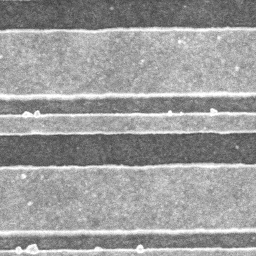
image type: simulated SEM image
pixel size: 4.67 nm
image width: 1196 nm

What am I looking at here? lines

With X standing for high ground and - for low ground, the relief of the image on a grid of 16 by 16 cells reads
----------------
----------------
XXXXXXXXXXXXXXXX
XXXXXXXXXXXXXXXX
XXXXXXXXXXXXXXXX
XXXXXXXXXXXXXXXX
XXXXXXXXXXXXXXXX
XXXXXXXXXXXXXXXX
----------------
----------------
XXXXXXXXXXXXXXXX
XXXXXXXXXXXXXXXX
XXXXXXXXXXXXXXXX
XXXXXXXXXXXXXXXX
XXXXXXXXXXXXXXXX
XXXXXXXXXXXXXXXX